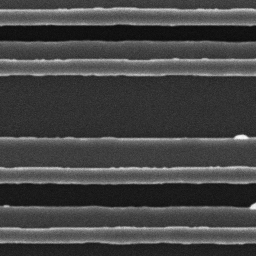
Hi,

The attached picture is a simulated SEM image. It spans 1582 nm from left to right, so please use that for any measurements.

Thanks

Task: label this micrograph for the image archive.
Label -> lines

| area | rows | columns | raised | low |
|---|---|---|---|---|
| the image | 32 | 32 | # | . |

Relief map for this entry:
################################
################################
################################
................................
................................
################################
################################
################################
################################
................................
................................
................................
................................
................................
................................
................................
................................
################################
################################
################################
################################
################################
################################
................................
................................
................................
################################
################################
################################
################################
................................
................................